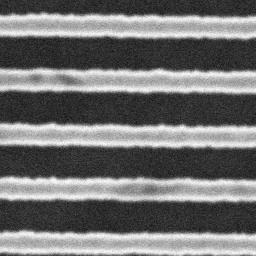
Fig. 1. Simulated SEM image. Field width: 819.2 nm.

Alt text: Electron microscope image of lines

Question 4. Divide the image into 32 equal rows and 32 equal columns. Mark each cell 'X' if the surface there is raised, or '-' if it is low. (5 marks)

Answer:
--------------------------------
--------------------------------
XXXXXXXXXXXXXXXXXXXXXXXXXXXXXXXX
XXXXXXXXXXXXXXXXXXXXXXXXXXXXXXXX
--------------XX-XXXXXXXXXXXXXXX
--------------------------------
--------------------------------
--------------------------------
--------------------------------
XXXXXXXXXXXXXXXXXXXXXXXXXXXXXXXX
XXXXXXXXXXXXXXXXXXXXXXXXXXXXXXXX
-----------------------------XXX
--------------------------------
--------------------------------
--------------------------------
------X-------------------------
XXXXXXXXXXXXXXXXXXXXXXXXXXXXXXXX
XXXXXXXXXXXXXXXXXXXXXXXXXXXXXXXX
--------------------------------
--------------------------------
--------------------------------
--------------------------------
XXXXXXXXXXXXXXXXXXX---XX--------
XXXXXXXXXXXXXXXXXXXXXXXXXXXXXXXX
XXXXXXXXXXXXXXXXXXXXXXXXXXXXXXXX
--------------------------------
--------------------------------
--------------------------------
--------------------------------
XXXXXXXXXXXXXXXXXXXXXXXXXXXXXXXX
XXXXXXXXXXXXXXXXXXXXXXXXXXXXXXXX
-XXXXXXXXXXXXXXXXXXXXXXXXXXXXXXX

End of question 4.